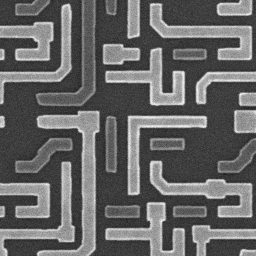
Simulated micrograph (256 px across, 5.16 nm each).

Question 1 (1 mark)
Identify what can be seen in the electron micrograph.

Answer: wiring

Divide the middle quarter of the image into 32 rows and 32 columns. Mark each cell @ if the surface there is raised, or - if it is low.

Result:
@@---@@@--------------@@--------
@@---@@@-------------@@@--------
@----@@@---@@@@@@@@@@@@@---@@@--
-----@@@---@@@@@@@@@@@@@---@@@--
-----@@@---@@@@@@@@@@@@@---@@@--
----@@@@--------------@@---@@@--
----@@@@--------------@@---@@@--
@@@@@@@---------------@@@@@@@@--
@@@@@@----------------@@@@@@@@--
@@@@@-----------------@@@@@@@@--
--------------------------------
--------------------------------
---@@@@@@-----------------------
@@@@@@@@@--@@---@@@@@@@@@@@@@@@@
@@@@@@@@@--@@---@@@@@@@@@@@@@@@@
@@@@@@@@@--@@---@@@@@@@@@@@@@@@@
----@@@@@--@@---@@@-------------
-----@@@---@@---@@@-------------
-----@@----@@---@@@-------------
@@---@@----@@---@@@---@@@@@@@@--
@@---@@----@@---@@@---@@@@@@@@--
@@---@@----@@---@@@-------------
-----@@----@@---@@@-------------
-----@@@---@@---@@@-------------
-----@@@---@@---@@@---@@--------
@----@@@---@@---@@@---@@--------
@----@@@---@@---@@@---@@--------
@----@@@--------@@@---@@--------
@@---@@@--------@@@---@@@-------
@@---@@@--------@@@---@@@@------
@@---@@@--------@@@----@@@@@@@@@
@@---@@@--------@@@-----@@@@@@@@